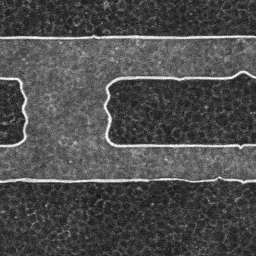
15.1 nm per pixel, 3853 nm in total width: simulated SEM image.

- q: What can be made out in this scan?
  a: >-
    one or a few lines or trenches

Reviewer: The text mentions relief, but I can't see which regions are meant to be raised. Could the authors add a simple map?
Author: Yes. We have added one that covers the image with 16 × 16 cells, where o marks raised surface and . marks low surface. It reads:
oooooooooooooooo
oooooooooooooooo
................
................
................
o......ooooooooo
oo.....ooooooooo
oo.....ooooooooo
o......ooooooooo
................
................
oooooooooooooooo
oooooooooooooooo
oooooooooooooooo
oooooooooooooooo
oooooooooooooooo